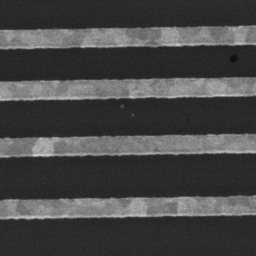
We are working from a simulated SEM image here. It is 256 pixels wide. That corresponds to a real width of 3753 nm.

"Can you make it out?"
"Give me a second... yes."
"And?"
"lines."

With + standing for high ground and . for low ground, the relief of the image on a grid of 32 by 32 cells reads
................................
................................
................................
........................++++++++
++++++++++++++++++++++++++++++++
++++++++++++++++++++++++++++++++
................................
................................
................................
................................
++++++++++++++++++++++++++++++++
++++++++++++++++++++++++++++++++
++++............................
................................
................................
................................
................................
++++++++++++++++++++++++++++++++
++++++++++++++++++++++++++++++++
++++++..........................
................................
................................
................................
................................
................................
++++++++++++++++++++++++++++++++
++++++++++++++++++++++++++++++++
................................
................................
................................
................................
................................